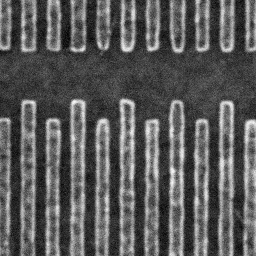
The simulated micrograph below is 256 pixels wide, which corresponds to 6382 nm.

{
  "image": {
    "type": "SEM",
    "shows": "wiring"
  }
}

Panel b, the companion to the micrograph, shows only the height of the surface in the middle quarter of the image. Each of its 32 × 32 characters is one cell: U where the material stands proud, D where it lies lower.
DDDDDDDDDDDDDDDDDDDDDDDDDDDDDDDD
DDDDDDDDDDDDDDDDDDDDDDDDDDDDDDDD
DDDDDDDDDDDDDDDDDDDDDDDDDDDDDDDD
DDDDDDDDDDDDDDDDDDDDDDDDDDDDDDDD
DDDDDDDDDDDDDDDDDDDDDDDDDDDDDDDD
DDDDDDDDDDDDDDDDDDDDDDDDDDDDDDDD
DDDDDDDDDDDDDDDDDDDDDDDDDDDDDDDD
DDDDDDDDDDDDDDDDDDDDDDDDDDDDDDDD
DDDDDDDDDDDDDDDDDDDDDDDDDDDDDDDD
DDDDDDDDDDDDDDDUDDDDDDDDDDDDDDDD
DDUUUDDDDDDDDDUUUDDDDDDDDDDUUDDD
DDUUUDDDDDDDDDDUUDDDDDDDDDDUUDDD
DDUUUDDDDDDDDDDUUDDDDDDDDDDUUUDD
DDUUUDDDDDDDDDDUUDDDDDDDDDDUUUDD
DDUUUDDDDUDDDDDUUDDDDUUDDDDUUUDD
DDUUUDDDDUUDDDDUUDDDDUUDDDDUUUDD
DDUUUDDDUUUDDDDUUDDDDUUDDDDUUUDD
DDUUUDDDUUUDDDDUUDDDDUUDDDDUUDDD
DDUUUDDDUUUDDDUUUDDDDUUDDDDUUDDD
DDUUUDDDUUUDDDUUUDDDDUUDDDDUUDDD
DDUUUDDDUUUDDDUUUDDDDUUDDDDUUDDD
DDUUUDDDUUUDDDUUUDDDDUUDDDDUUDDD
DDUUUDDDUUUDDDUUUDDDDUUDDDDUUDDD
DDUUUDDDUUUDDDUUUDDDDUUDDDDUUDDD
DDUUUDDDUUUDDDUUUDDDDUUDDDDUUDDD
DDUUUDDDUUUDDDUUUDDDDUUDDDDUUDDD
DDUUUDDDUUUDDDDUUDDDDUUDDDDUUDDD
DDUUUDDDUUUDDDDUUDDDDUUDDDDUUDDD
DDUUUDDDUUUDDDDUUDDDDUUDDDDUUDDD
DDUUUDDDUUUDDDDUUDDDDUUDDDDUUDDD
DDUUUDDDUUUDDDUUUDDDDUUDDDDUUDDD
DDUUUDDDUUUDDDUUUDDDDUUDDDDUUDDD